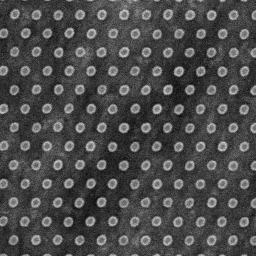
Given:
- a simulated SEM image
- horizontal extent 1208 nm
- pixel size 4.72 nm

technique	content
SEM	a regular array of raised bodies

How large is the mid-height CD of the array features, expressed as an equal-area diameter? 41.6 nanometres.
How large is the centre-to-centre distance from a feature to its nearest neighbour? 100 nanometers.